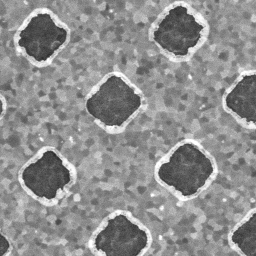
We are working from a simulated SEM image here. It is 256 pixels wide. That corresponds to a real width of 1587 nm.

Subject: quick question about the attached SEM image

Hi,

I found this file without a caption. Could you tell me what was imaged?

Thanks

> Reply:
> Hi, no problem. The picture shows holes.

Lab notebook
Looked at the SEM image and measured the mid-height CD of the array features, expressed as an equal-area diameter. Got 0.279 µm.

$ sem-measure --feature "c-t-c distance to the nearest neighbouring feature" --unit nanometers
599